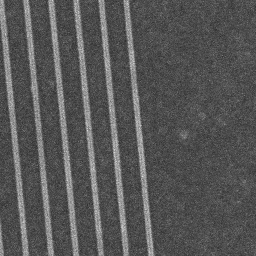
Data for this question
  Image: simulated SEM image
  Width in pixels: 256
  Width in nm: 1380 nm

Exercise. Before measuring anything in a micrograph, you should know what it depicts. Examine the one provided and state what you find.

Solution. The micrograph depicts parallel lines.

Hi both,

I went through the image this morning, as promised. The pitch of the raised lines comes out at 134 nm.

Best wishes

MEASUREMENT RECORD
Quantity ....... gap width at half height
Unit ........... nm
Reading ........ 111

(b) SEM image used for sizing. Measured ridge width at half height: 24.1 nm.